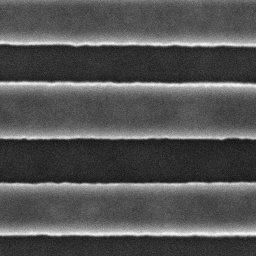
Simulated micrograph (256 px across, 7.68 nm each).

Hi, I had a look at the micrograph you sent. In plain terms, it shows lines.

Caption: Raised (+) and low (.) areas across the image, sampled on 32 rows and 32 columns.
++++++++++++++++++++++++++++++++
++++++++++++++++++++++++++++++++
++++++++++++++++++++++++++++++++
++++++++++++++++++++++++++++++++
++++++++++++++++++++++++++++++++
.........+.++..+.+.+++++++++++++
................................
................................
................................
................................
++++++.++....+..................
++++++++++++++++++++++++++++++++
++++++++++++++++++++++++++++++++
++++++++++++++++++++++++++++++++
++++++++++++++++++++++++++++++++
++++++++++++++++++++++++++++++++
++++++++++++++++++++++++++++++++
................................
................................
................................
................................
................................
................................
++++++++++++++++++++++++++++++++
++++++++++++++++++++++++++++++++
++++++++++++++++++++++++++++++++
++++++++++++++++++++++++++++++++
++++++++++++++++++++++++++++++++
++++++++++++++++++++++++++++++++
................................
................................
................................